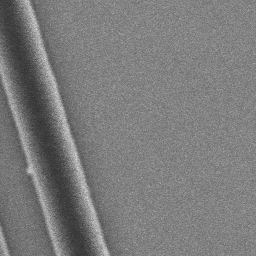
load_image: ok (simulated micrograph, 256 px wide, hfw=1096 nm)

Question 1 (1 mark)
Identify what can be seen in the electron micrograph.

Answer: one or a few lines or trenches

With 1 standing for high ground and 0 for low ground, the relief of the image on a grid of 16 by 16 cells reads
1100000000000000
1100000000000000
1110000000000000
1110000000000000
1110000000000000
1111000000000000
0111000000000000
0111000000000000
0111000000000000
0011100000000000
0011100000000000
0011100000000000
0001110000000000
0001110000000000
0001110000000000
0001111000000000